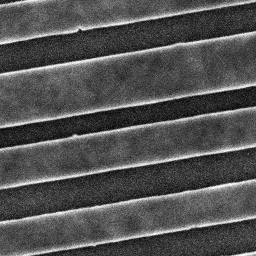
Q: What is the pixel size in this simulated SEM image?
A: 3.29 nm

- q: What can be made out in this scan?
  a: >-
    one or a few lines or trenches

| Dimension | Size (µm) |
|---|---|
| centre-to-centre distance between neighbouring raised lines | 0.228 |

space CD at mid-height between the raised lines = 0.0973 microns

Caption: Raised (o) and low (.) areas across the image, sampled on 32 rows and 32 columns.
.ooooooooooooooooooooooooooooo..
oooooooooooooooooooooooo........
oooooooooooooooooo..............
oooooooooooo....................
ooooo........................ooo
......................oooooooooo
.................ooooooooooooooo
...........ooooooooooooooooooooo
.....ooooooooooooooooooooooooooo
oooooooooooooooooooooooooooooooo
oooooooooooooooooooooooooooooooo
ooooooooooooooooooooooooooo.....
ooooooooooooooooooooo...........
ooooooooooooooo................o
ooooooooo................ooooooo
ooo................ooooooooooooo
.............ooooooooooooooooooo
.......ooooooooooooooooooooooooo
.oooooooooooooooooooooooooooooo.
oooooooooooooooooooooooo........
ooooooooooooooooooo.............
oooooooooooo....................
ooooooo.........................
o.........................oooooo
....................oooooooooooo
..............oooooooooooooooooo
........oooooooooooooooooooooooo
..oooooooooooooooooooooooooooo..
oooooooooooooooooooooooo........
oooooooooooooooooo..............
oooooooooooo....................
oooooo..........................